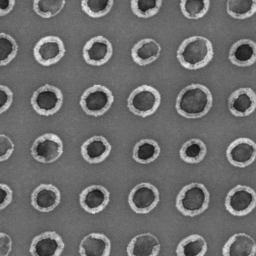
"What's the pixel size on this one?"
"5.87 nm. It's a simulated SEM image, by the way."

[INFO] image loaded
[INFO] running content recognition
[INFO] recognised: a regular array of raised bodies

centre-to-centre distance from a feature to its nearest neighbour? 282 nanometers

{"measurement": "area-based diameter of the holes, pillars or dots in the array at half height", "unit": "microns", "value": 0.172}